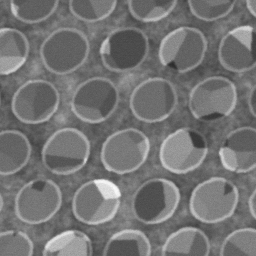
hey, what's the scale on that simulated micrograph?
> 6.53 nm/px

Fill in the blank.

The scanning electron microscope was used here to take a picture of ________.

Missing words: a regular array of raised bodies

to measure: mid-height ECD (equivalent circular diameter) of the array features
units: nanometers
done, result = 289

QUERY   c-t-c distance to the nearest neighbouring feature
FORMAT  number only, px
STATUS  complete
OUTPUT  58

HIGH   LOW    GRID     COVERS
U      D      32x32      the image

DDUUUUUDDUUUUUDDUUUUUUDDUUUUUDDU
DDUUUUDDDUUUUUDDDUUUUDDDUUUUUDDD
DDDUUDDDDDDUDDDDDDDDDDDDDDDDDDDD
DDDDDDDDDDDDDDDDDDDDDDDDDDDDDDDD
UUUDDDUUUUDDDDUUUUDDDUUUUDDDUUUU
UUUDDUUUUUUDDUUUUUDDUUUUUUDDUUUU
UUUDDUUUUUUDDUUUUUDDUUUUUUDUUUUU
UUUDDUUUUUUDDUUUUUDDUUUUUDDDUUUU
UUDDDDUUUDDDDDUUUDDDDUUUDDDDUUUD
DDDDDDDDDDDDDDDDDDDDDDDDDDDDDDDD
DDDUUUDDDDUUUUDDDDUUUDDDDUUUUDDD
DDUUUUUDDDUUUUUDDUUUUUDDUUUUUDDU
DDUUUUUDDUUUUUUDUUUUUUDDUUUUUDDU
DDUUUUUDDUUUUUDDDUUUUUDDUUUUUDDU
DDUUUUDDDDUUUUDDDUUUUDDDDUUUDDDD
DDDDDDDDDDDDDDDDDDDDDDDDDDDDDDDD
DDDDDDDUUUDDDDDUUDDDDDUUUDDDDUUU
UUUDDDUUUUUDDUUUUUDDDUUUUUDDUUUU
UUUUDDUUUUUDDUUUUUUDUUUUUUDDUUUU
UUUUDUUUUUUDDUUUUUDDUUUUUUDDUUUU
UUUDDDUUUUDDDUUUUUDDUUUUUDDDUUUU
UUDDDDDUUDDDDDDUDDDDDDDDDDDDDDDD
DDDDDUDDDDDDDDDDDDDDDDDDDDDUDDDD
DDDUUUUDDDUUUUDDDUUUUUDDDUUUUDDD
DDUUUUUDDUUUUUUDDUUUUUDDUUUUUUDD
DDUUUUUDDUUUUUUDDUUUUUDDUUUUUDDU
DDUUUUUDDUUUUUDDDUUUUUDDUUUUUDDD
DDDUUUDDDDUUUDDDDDUUDDDDDUUDDDDD
DDDDDDDDDDDDDDDDDDDDDDDDDDDDDDDD
UUUDDDDDUUUDDDUUUUDDDDUUUUDDDUUU
UUUUDDUUUUUDDUUUUUUDDUUUUUDDUUUU
UUUUDDUUUUUDDUUUUUUDUUUUUUDDUUUU